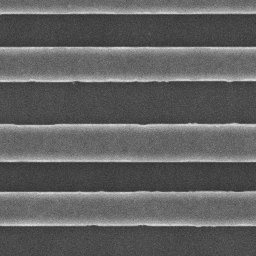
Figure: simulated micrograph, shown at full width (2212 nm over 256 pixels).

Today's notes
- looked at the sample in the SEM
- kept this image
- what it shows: lines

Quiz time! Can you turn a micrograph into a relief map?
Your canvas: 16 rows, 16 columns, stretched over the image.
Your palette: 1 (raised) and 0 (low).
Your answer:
1111111111111111
0000000000000000
0000000000000000
1111111111111111
1111111111111111
0000000000000000
0000000000000000
0000000000000000
1111111111111111
1111111111111111
0000000000000000
0000000000000000
1111111111111111
1111111111111111
0000000000000000
0000000000000000